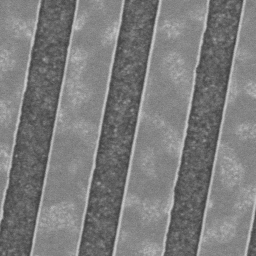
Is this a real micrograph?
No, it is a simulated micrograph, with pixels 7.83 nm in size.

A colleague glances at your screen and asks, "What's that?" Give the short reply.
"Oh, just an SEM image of one or a few lines or trenches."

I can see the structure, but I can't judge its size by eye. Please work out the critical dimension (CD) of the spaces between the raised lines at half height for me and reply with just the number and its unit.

0.282 µm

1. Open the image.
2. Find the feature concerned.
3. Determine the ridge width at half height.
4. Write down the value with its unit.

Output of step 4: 0.369 microns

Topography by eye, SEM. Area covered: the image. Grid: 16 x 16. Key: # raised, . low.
##...###..###..#
##...##...###..#
##..###...###..#
##..###..###...#
##..###..###..##
##..###..###..##
#...###..###..##
#...##...###..##
#..###..####..##
#..###..###...##
#..###..###..###
...###..###..###
...##...###..###
..###...###..###
..###..###...###
..###..###..###.